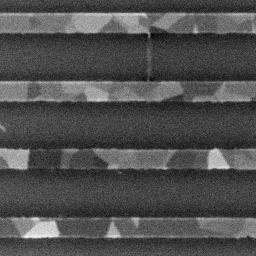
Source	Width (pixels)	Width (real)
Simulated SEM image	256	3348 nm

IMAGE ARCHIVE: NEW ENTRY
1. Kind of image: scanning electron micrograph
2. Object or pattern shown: lines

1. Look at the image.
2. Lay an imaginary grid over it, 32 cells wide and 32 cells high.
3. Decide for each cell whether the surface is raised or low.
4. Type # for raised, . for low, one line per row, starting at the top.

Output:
................................
................................
################################
################################
................................
................................
................................
................................
................................
................................
################################
################################
#####.##########################
................................
................................
................................
................................
................................
................................
################################
################################
................................
................................
................................
................................
................................
................................
################################
################################
#######.########################
................................
................................